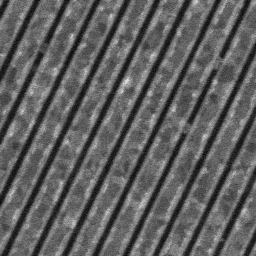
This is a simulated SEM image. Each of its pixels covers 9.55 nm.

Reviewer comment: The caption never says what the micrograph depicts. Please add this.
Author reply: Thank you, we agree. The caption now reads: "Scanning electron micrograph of parallel lines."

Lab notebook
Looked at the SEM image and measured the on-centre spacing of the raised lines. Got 260 nm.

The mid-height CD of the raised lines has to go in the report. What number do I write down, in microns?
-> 0.168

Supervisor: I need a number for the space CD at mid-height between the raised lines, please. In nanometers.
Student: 92.4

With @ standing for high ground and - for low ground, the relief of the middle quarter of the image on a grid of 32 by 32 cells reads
--@@@@---@@@@@---@@@@@---@@@@---
-@@@@@---@@@@@--@@@@@---@@@@@--@
-@@@@----@@@@---@@@@@---@@@@---@
@@@@@---@@@@@--@@@@@---@@@@@--@@
@@@@@--@@@@@---@@@@@---@@@@---@@
@@@@---@@@@@--@@@@@---@@@@@---@@
@@@@--@@@@@---@@@@@---@@@@---@@@
@@@---@@@@@--@@@@@---@@@@@---@@@
@@@--@@@@@---@@@@@---@@@@---@@@@
@@---@@@@@--@@@@@---@@@@@---@@@@
@@--@@@@@---@@@@@---@@@@---@@@@@
@---@@@@@--@@@@@---@@@@@---@@@@@
@--@@@@@---@@@@@---@@@@---@@@@@-
---@@@@@---@@@@---@@@@@---@@@@--
--@@@@@---@@@@@---@@@@---@@@@@--
--@@@@@---@@@@---@@@@@---@@@@---
--@@@@---@@@@@---@@@@---@@@@@---
-@@@@@---@@@@---@@@@@---@@@@@--@
-@@@@---@@@@@---@@@@---@@@@@---@
@@@@@---@@@@---@@@@@---@@@@@--@@
@@@@---@@@@@---@@@@---@@@@@---@@
@@@@---@@@@---@@@@@---@@@@@--@@@
@@@---@@@@@---@@@@@--@@@@@---@@@
@@@---@@@@---@@@@@---@@@@@--@@@@
@@---@@@@@---@@@@@--@@@@@---@@@@
@@---@@@@@--@@@@@---@@@@@--@@@@@
@---@@@@@---@@@@@--@@@@@---@@@@@
@---@@@@@--@@@@@---@@@@@---@@@@-
@--@@@@@---@@@@@--@@@@@---@@@@@-
---@@@@@--@@@@@---@@@@@---@@@@--
--@@@@@---@@@@@--@@@@@---@@@@@--
--@@@@@--@@@@@---@@@@@---@@@@---